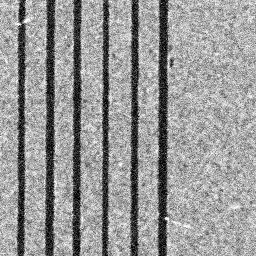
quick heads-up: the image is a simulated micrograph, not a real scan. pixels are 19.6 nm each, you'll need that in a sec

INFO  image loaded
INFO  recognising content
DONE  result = parallel lines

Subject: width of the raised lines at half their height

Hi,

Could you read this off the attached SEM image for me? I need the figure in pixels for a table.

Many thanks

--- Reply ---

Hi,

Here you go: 19.9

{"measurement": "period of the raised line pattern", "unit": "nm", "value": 550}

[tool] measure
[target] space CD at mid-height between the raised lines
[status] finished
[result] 164 nanometers